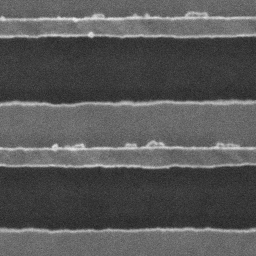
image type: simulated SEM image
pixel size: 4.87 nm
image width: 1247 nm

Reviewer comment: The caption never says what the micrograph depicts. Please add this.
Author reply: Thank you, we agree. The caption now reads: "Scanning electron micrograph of lines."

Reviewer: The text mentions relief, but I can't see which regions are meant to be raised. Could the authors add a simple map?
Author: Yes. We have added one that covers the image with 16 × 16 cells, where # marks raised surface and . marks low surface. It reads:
################
################
................
................
................
................
.....##..#######
################
################
################
.........#......
................
................
................
################
################